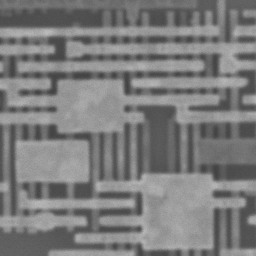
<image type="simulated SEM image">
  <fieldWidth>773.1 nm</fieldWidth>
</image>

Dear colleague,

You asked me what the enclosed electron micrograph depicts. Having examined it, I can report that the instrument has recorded wiring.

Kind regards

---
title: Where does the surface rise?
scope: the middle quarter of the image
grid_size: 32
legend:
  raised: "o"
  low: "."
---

oooooooooooooooooooooooooooooooo
oooooooooooooooo....oooooooooooo
................................
................................
ooooooooooooooo..ooooooooooooooo
ooooooooooooooo..ooooooooooooooo
ooooooooooooooo.................
ooooooooooooooo.................
oooooooooooooooooooooooooooooooo
oooooooooooooooooooooooooooooooo
ooooooooooooooo.............ooo.
ooooooooooooooo.............ooo.
oooooooooooooooooooo........oooo
oooooooooooooooooooo........oooo
ooooooooooooooo..............ooo
ooooooooooooooo.................
ooooooooooooooo.................
................................
................................
oooooo..........................
oooooo..........................
oooooo..........................
oooooo..........................
oooooo..........................
oooooo..........................
oooooo..........................
oooooo..........................
oooooo..........................
oooooo..............oooooooooooo
.........ooooooooooooooooooooooo
........oooooooooooooooooooooooo
........oooooooooooooooooooooooo